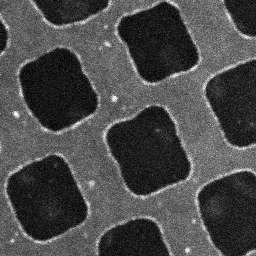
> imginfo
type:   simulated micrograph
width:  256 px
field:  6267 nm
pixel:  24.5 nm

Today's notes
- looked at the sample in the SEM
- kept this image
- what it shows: holes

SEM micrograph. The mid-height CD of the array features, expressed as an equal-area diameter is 1.92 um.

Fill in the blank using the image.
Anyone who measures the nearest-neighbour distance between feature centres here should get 2680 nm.